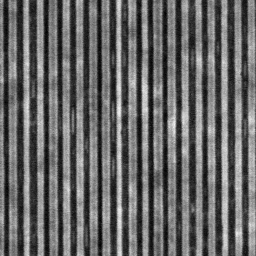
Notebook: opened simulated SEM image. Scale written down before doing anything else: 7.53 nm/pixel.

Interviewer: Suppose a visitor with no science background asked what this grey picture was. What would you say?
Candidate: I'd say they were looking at parallel lines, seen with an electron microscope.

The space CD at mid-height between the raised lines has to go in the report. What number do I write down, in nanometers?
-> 49.9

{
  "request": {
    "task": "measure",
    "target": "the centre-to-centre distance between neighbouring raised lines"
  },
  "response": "99.9 nanometres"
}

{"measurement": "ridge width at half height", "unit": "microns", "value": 0.049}